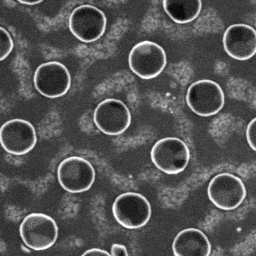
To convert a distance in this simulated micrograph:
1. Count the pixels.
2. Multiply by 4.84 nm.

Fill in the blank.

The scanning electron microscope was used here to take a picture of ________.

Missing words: a regular array of raised bodies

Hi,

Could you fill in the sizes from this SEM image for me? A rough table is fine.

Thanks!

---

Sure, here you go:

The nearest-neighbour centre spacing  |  322 nm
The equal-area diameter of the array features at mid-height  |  177 nm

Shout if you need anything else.